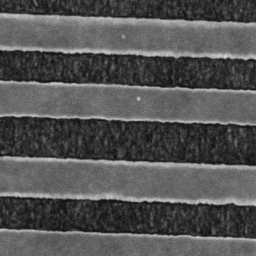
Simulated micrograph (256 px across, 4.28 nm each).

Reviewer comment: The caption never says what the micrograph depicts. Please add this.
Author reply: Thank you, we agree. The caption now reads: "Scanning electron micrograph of lines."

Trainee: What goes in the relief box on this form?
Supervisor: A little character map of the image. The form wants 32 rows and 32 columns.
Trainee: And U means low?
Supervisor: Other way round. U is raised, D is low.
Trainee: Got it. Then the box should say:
DDDDDDDDDDDDDDDDDDDDDDDDDDDDDDDD
DDDDDDDDDDDDDDDDDDDDDDDDDDDDDDDD
UUUUUUUUUUUUUUUUUDDDDDDDDDDDDDDD
UUUUUUUUUUUUUUUUUUUUUUUUUUUUUUUU
UUUUUUUUUUUUUUUUUUUUUUUUUUUUUUUU
UUUUUUUUUUUUUUUUUUUUUUUUUUUUUUUU
DDDDDDDDUUUUUUUUUUUUUUUUUUUUUUUU
DDDDDDDDDDDDDDDDDDDDDDDDDDDDDDDD
DDDDDDDDDDDDDDDDDDDDDDDDDDDDDDDD
DDDDDDDDDDDDDDDDDDDDDDDDDDDDDDDD
UUUUUUUUUUDDDDDDDDDDDDDDDDDDDDDD
UUUUUUUUUUUUUUUUUUUUUUUUUUUUUUUU
UUUUUUUUUUUUUUUUUUUUUUUUUUUUUUUU
UUUUUUUUUUUUUUUUUUUUUUUUUUUUUUUU
UUUDUUUUUUUUUUUUUUUUUUUUUUUUUUUU
DDDDDDDDDDDDDDDDDDDDDDDDDDDDUUUU
DDDDDDDDDDDDDDDDDDDDDDDDDDDDDDDD
DDDDDDDDDDDDDDDDDDDDDDDDDDDDDDDD
DDDDDDDDDDDDDDDDDDDDDDDDDDDDDDDD
DDDDDDDDDDDDDDDDDDDDDDDDDDDDDDDD
UUUUUUUUUUUUUUUUUUUUUUUUDDDDDDDD
UUUUUUUUUUUUUUUUUUUUUUUUUUUUUUUU
UUUUUUUUUUUUUUUUUUUUUUUUUUUUUUUU
UUUUUUUUUUUUUUUUUUUUUUUUUUUUUUUU
DDDDUUUUUUUUUUUUUUUUUUUUUUUUUUUU
DDDDDDDDDDDDDDDDDDDDDDDDDDUUDUUU
DDDDDDDDDDDDDDDDDDDDDDDDDDDDDDDD
DDDDDDDDDDDDDDDDDDDDDDDDDDDDDDDD
DDDDDDDDDDDDDDDDDDDDDDDDDDDDDDDD
UUUUUUUUUUUUUUUUUUUUUUUUDDDDDDDD
UUUUUUUUUUUUUUUUUUUUUUUUUUUUUUUU
UUUUUUUUUUUUUUUUUUUUUUUUUUUUUUUU